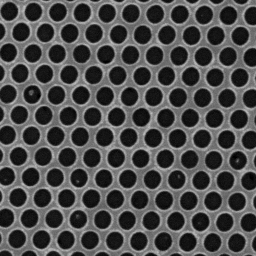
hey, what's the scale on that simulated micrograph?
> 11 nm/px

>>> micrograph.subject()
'a regular array of holes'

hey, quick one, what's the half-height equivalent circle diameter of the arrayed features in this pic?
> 208 nanometres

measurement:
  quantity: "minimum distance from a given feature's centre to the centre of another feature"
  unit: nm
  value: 262